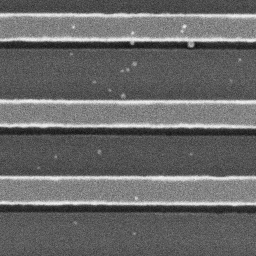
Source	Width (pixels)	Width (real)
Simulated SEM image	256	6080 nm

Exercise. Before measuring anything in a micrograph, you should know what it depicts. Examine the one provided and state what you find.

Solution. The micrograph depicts lines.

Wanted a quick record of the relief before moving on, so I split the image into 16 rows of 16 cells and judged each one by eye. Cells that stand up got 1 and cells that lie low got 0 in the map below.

0000000000000000
1111111111111111
1111111111111111
0000000000000000
0000000000000000
0000000000000000
1111111111111111
1111111111111111
0000000000000000
0000000000000000
0000000000000000
1111111111111111
1111111111111111
0000000000000000
0000000000000000
0000000000000000